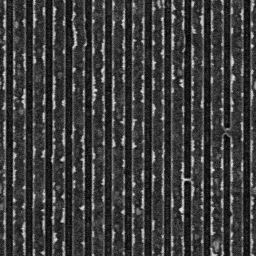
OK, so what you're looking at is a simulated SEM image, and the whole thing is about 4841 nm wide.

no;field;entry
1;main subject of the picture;parallel lines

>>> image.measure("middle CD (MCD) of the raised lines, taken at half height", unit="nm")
234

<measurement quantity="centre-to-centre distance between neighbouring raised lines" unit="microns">0.374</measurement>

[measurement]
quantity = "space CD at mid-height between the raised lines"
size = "144 nanometres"